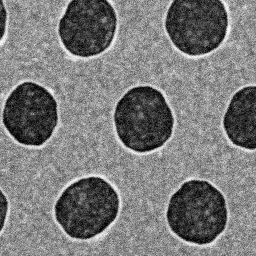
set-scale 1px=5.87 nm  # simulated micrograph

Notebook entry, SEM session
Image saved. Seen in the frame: holes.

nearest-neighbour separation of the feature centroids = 622 nanometres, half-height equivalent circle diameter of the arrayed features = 366 nm